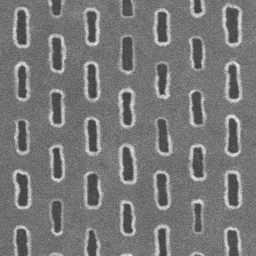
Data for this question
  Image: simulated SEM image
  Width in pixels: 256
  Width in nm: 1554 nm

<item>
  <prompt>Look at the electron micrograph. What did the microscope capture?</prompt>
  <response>a regular array of holes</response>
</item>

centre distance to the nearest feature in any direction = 263 nm